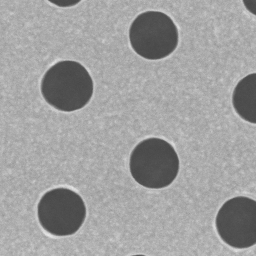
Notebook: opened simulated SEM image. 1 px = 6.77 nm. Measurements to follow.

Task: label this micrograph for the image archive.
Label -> holes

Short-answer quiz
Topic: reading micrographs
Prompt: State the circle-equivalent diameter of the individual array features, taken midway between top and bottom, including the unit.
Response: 49.2 px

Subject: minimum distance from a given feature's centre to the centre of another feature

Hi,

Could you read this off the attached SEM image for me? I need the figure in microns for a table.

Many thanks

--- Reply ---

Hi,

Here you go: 0.693